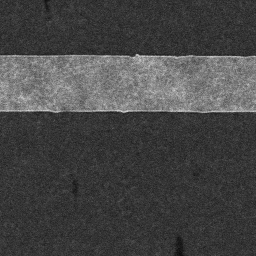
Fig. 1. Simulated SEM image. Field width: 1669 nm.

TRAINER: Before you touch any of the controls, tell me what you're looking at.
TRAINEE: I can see one or a few lines or trenches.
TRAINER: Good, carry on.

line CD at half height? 359 nanometers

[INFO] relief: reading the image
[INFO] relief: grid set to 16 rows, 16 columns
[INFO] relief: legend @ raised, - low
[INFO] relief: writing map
----------------
----------------
----------------
@@-@@-----------
@@@@@@@@@@@@@@@@
@@@@@@@@@@@@@@@@
@@@@@@@@@@@@@@@@
----------------
----------------
----------------
----------------
----------------
----------------
----------------
----------------
----------------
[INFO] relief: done